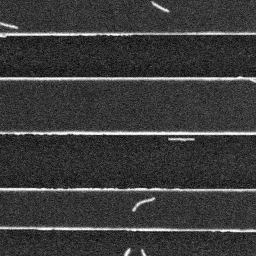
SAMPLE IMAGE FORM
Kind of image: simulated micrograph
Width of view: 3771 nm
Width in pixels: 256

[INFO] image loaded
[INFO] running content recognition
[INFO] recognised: lines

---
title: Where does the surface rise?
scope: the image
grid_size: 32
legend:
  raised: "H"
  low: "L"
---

HHHHHHHHHHHHHHHHHHHHHHHHHHHHHHHH
HHHHHHHHHHHHHHHHHHHHHHHHHHHHHHHH
HHHHHHHHHHHHHHHHHHHHHHHHHHHHHHHH
HHHHHHHHHHHHHHHHHHHHHHHHHHHHHHHH
HLLLLLLLLLLLLLLLLLLLLLLLLLLLLLLL
LLLLLLLLLLLLLLLLLLLLLLLLLLLLLLLL
LLLLLLLLLLLLLLLLLLLLLLLLLLLLLLLL
LLLLLLLLLLLLLLLLLLLLLLLLLLLLLLLL
LLLLLLLLLLLLLLLLLLLLLLLLLLLLLLLL
LLLLLLLLLLLLLLLLLLLLLLLLLLLLLLLL
HHHHHHHHHHHHHHHHHHHHHHHHHHHHHHHH
HHHHHHHHHHHHHHHHHHHHHHHHHHHHHHHH
HHHHHHHHHHHHHHHHHHHHHHHHHHHHHHHH
HHHHHHHHHHHHHHHHHHHHHHHHHHHHHHHH
HHHHHHHHHHHHHHHHHHHHHHHHHHHHHHHH
HHHHHHHHHHHHHHHHHHHHHHHHHHHHHHHH
HHHHHHHHHHHHHHHHHHHHHHHHHHHHHHHH
LLLLLLLLLLLLLLLLLLLLLLLLLLLLLLLL
LLLLLLLLLLLLLLLLLLLLLLLLLLLLLLLL
LLLLLLLLLLLLLLLLLLLLLLLLLLLLLLLL
LLLLLLLLLLLLLLLLLLLLLLLLLLLLLLLL
LLLLLLLLLLLLLLLLLLLLLLLLLLLLLLLL
LLLLLLLLLLLLLLLLLLLLLLLLLLLLLLLL
LLLLLLLLLLLLLLLLLLLLLLLLLLLLLLLL
HHHHHHHHHHHHHHHHHHHHHHHHHHHHHHHH
HHHHHHHHHHHHHHHHHHHHHHHHHHHHHHHH
HHHHHHHHHHHHHHHHHHHHHHHHHHHHHHHH
HHHHHHHHHHHHHHHHHHHHHHHHHHHHHHHH
HHHHHHHHHHHHHHHHHHHHHHHHHHHHHHHH
LLLLLLLLLLLLLLLLLLLLLLLLLLLLLLLL
LLLLLLLLLLLLLLLLLLLLLLLLLLLLLLLL
LLLLLLLLLLLLLLLLLLLLLLLLLLLLLLLL